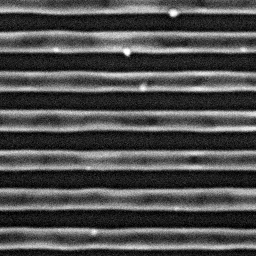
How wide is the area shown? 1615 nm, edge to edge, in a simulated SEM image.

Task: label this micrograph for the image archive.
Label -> wiring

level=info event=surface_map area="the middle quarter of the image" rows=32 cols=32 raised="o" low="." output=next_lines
................................
................................
oooooooooooooooooooooooooooooooo
oooooooooooooooooooooooooooooooo
oooooooooooooooooooooooooooooooo
oooooooooooooooooooooooooooooooo
ooooooooooooooooooooooo...oooooo
................................
................................
................................
................................
................................
oooooooooooooooooooooooooooooooo
oooooooooooooooooooooooooooooooo
oooooooooooooooooooooooooooooooo
oooooooooooooooooooooooooooooooo
ooooo.............oooooooo...ooo
................................
................................
................................
................................
................................
oooooooooooooooooooooooooooooooo
oooooooooooooooooooooooooooooooo
oooooooooooooooooooooooooooooooo
oooooooooooooooooooooooooooooooo
................................
................................
................................
................................
................................
.....oooooo.....................